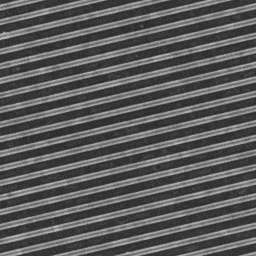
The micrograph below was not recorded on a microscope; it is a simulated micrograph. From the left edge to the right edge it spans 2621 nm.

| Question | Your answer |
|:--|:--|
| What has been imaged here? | parallel lines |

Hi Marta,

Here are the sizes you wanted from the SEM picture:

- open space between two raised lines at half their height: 108 nanometers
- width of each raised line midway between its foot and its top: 39.8 nanometres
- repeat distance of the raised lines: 146 nm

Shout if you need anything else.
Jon